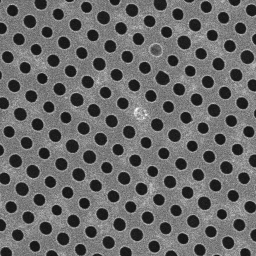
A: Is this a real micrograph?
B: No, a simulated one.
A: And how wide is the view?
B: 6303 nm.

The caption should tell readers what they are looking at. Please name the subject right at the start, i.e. a regular array of holes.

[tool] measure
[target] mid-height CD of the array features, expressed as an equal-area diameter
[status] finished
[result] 297 nm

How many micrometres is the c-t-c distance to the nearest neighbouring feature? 0.497